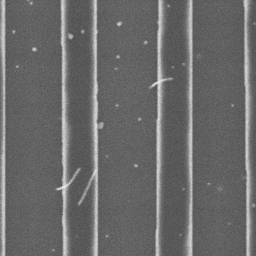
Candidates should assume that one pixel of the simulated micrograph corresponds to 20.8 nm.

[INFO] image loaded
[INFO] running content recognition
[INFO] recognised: lines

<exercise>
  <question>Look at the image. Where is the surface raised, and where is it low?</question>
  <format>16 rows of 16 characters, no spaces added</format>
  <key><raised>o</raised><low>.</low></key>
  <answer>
....oo....oo...o
....oo....oo...o
....oo....oo...o
....oo....oo...o
....oo....oo...o
....oo....oo...o
....oo....oo...o
....oo....oo...o
....oo....oo...o
....oo....oo...o
....oo....oo...o
....oo....oo...o
....oo....oo...o
....oo....oo...o
....oo....oo...o
....oo....oo...o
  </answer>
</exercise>